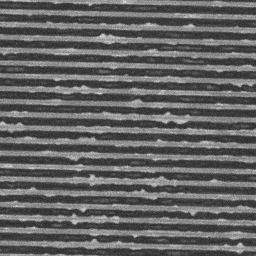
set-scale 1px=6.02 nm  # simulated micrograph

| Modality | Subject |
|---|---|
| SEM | parallel lines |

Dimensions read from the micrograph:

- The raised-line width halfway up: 0.0286 µm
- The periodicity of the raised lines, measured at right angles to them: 77.3 nm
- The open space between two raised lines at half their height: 45.1 nm